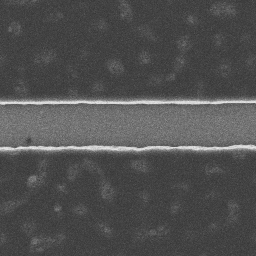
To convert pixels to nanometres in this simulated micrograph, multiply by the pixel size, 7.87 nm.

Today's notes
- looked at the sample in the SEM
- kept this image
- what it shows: one or a few lines or trenches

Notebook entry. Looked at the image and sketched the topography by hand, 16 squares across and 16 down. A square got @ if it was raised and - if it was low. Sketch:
@@@@@@@@@@@@@@@@
@@@@@@@@@@@@@@@@
@@@@@@@@@@@@@@@@
@@@@@@@@@@@@@@@@
@@@@@@@@@@@@@@@@
@@@@@@@@@@@@@@@@
----------------
----------------
----------------
@@@@@@@@@@@@@@@@
@@@@@@@@@@@@@@@@
@@@@@@@@@@@@@@@@
@@@@@@@@@@@@@@@@
@@@@@@@@@@@@@@@@
@@@@@@@@@@@@@@@@
@@@@@@@@@@@@@@@@